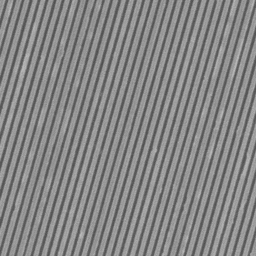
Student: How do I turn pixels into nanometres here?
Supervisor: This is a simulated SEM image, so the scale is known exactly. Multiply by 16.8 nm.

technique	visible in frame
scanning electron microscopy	parallel lines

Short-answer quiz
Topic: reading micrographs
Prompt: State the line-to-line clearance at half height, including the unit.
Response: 0.0527 um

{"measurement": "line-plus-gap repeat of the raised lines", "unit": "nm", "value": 130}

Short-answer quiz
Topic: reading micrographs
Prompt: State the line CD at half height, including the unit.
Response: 79 nanometers